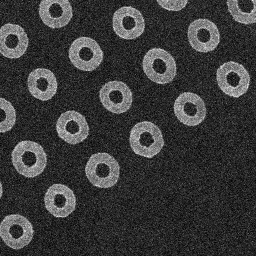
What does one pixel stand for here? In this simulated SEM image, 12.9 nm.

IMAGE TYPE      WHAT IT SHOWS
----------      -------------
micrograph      a regular array of ring-shaped raised bodies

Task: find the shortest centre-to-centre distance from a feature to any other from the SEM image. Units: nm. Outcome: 677